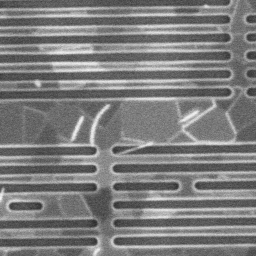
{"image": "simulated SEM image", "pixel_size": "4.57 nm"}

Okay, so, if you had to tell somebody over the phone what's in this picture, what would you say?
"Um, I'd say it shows groups of lines, slits or small figures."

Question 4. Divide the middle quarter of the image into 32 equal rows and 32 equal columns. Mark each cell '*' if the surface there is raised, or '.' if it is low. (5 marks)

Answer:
********************************
*****...........................
................................
................................
*********....*******************
********************************
................................
................................
................................
********************************
********************************
********************************
********************************
********************************
********************************
********************************
********************************
********************************
********************************
********************************
.......******......**...........
........****....................
........****....................
********************************
******************************..
........****....................
........****....................
.......*************************
********************************
***************.............****
........****.................***
........*****...............****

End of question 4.